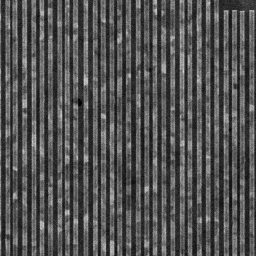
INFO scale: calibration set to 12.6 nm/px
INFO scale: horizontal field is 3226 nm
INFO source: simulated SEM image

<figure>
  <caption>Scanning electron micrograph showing parallel lines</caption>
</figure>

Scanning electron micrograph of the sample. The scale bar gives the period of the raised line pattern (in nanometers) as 110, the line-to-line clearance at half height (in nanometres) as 56.7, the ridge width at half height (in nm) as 50.4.